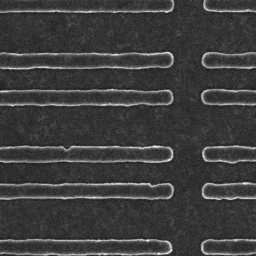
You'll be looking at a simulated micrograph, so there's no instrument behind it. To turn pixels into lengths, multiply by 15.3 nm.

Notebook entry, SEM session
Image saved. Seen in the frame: parallel lines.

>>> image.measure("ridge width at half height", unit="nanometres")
234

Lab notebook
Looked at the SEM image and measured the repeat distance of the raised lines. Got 0.715 µm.